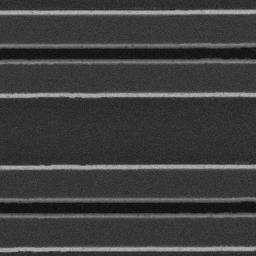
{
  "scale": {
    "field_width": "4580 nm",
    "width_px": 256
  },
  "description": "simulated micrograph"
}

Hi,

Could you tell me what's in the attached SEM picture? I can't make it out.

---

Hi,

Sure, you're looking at lines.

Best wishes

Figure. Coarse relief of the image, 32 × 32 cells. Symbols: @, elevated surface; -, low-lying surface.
--------------------------------
--------------------------------
@@@@@@@@@@@@@@@@@@@@@@@@@@@@@@@@
@@@@@@@@@@@@@@@@@@@@@@@@@@@@@@@@
@@@@@@@@@@@@@@@@@@@@@@@@@@@@@@@@
@@@@@@@@@@@@@@@@@@@@@@@@@@@@@@@@
--------------------------------
--------------------------------
@@@@@@@@@@@@@@@@@@@@@@@@@@@@@@@@
@@@@@@@@@@@@@@@@@@@@@@@@@@@@@@@@
@@@@@@@@@@@@@@@@@@@@@@@@@@@@@@@@
@@@@@@@@@@@@@@@@@@@@@@@@@@@@@@@@
--------------------------------
--------------------------------
--------------------------------
--------------------------------
--------------------------------
--------------------------------
--------------------------------
--------------------------------
--------------------------------
@@@@@@@@@@@@@@@@@@@@@@@@@@@@@@@@
@@@@@@@@@@@@@@@@@@@@@@@@@@@@@@@@
@@@@@@@@@@@@@@@@@@@@@@@@@@@@@@@@
@@@@@@@@@@@@@@@@@@@@@@@@@@@@@@@@
--------------------------------
--------------------------------
@@@@@@@@@@@@@@@@@@@@@@@@@@@@@@@@
@@@@@@@@@@@@@@@@@@@@@@@@@@@@@@@@
@@@@@@@@@@@@@@@@@@@@@@@@@@@@@@@@
@@@@@@@@@@@@@@@@@@@@@@@@@@@@@@@@
--------------------------------